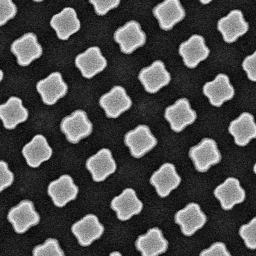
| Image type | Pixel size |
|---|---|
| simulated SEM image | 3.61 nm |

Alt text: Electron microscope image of a regular array of raised bodies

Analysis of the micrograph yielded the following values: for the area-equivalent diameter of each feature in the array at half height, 100 nanometers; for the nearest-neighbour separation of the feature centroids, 166 nanometers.